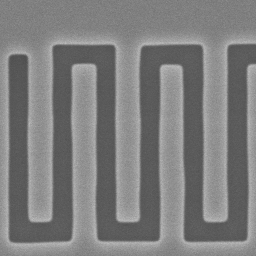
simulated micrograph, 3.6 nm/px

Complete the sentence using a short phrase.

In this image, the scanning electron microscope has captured groups of lines, slits or small figures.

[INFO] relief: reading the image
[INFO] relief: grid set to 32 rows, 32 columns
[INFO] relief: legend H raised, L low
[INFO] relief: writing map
HHHHHHHHHHHHHHHHHHHHHHHHHHHHHHHH
HHHHHHHHHHHHHHHHHHHHHHHHHHHHHHHH
HHHHHHHHHHHHHHHHHHHHHHHHHHHHHHHH
HHHHHHHHHHHHHHHHHHHHHHHHHHHHHHHH
HHHHHHHHHHHHHHHHHHHHHHHHHHHHHHHH
HHHHHHHLLLLLLLHHHHHHLLLLLHHHHLLL
HHHHHHLLLLLLLLLHHLLLLLLLLHHHLLLL
HLLLHHHLLLLLLLLHHLLLLLLLLHHHLLLL
HLLLHHHLLHHHLLLHHLLLHHHLLHHHLLLH
HLLLHHHLLHHHLLLHHLLLHHHLLHHHLLLH
HLLLHHHLLHHHLLLHHLLLHHHLLHHHLLLH
HLLLHHLLLHHHLLLHHLLLHHHLLHHHLLLH
HLLLHHLLLHHHLLLHHLLLHHHLLHHHLLLH
HLLLHHHLLHHHLLLHHLLLHHHLLHHHLLLH
HLLLHHHLLHHHLLLHHLLLHHHLLHHHLLLH
HLLLHHHLLHHHLLLHHLLLHHHLLHHHLLLH
HLLLHHHLLHHHLLLHHLLLHHHLLHHHLLLH
HLLLHHHLLHHHLLLHHLLLHHHLLLHHLLLH
HLLLHHHLLHHHLLLHHLLLHHHLLLHHLLLH
HLLLHHHLLHHHLLLHHLLLHHHLLLHHLLLH
HLLLHHHLLHHHLLLHHLLLHHHLLHHHLLLH
HLLLHHHLLHHHLLLHHLLLHHHLLHHHLLLH
HLLLHHHLLHHHLLLHHLLLHHHLLHHHLLLH
HLLLHHHLLHHHLLLHHLLLHHHLLHHHLLLH
HLLLHHHLLHHHLLLHHLLLHHHLLHHHLLLH
HLLLHHHLLHHHLLLHHLLLHHHLLHHHLLLH
HLLLHHLLLHHHLLLHHLLLHHHLLHHHLLLH
HLLLHHLLLHHHLLLHHLLLHHHLLLHHLLLH
HLLLLLLLLHHHLLLLLLLLHHHLLLLLLLLH
HLLLLLLLLHHHLLLLLLLLHHHLLLLLLLLH
HHHHHHHHHHHHHHHHHHHHHHHHHHHHHHHH
HHHHHHHHHHHHHHHHHHHHHHHHHHHHHHHH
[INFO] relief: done